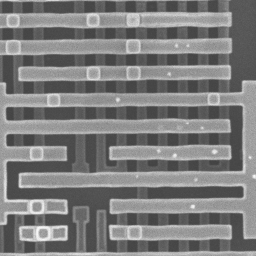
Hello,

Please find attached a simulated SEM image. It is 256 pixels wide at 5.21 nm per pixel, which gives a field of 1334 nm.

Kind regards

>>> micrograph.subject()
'wiring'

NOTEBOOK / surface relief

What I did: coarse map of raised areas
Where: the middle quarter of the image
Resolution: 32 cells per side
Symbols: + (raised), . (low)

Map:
................................
++++++++++++++++++++++++++++++++
++++++++++++++++++++++++++++++++
++++++++++++++++++++++++++++++++
................................
................................
................................
++++++++++++++++++++++++++++++++
++++++++++++++++++++++++++++++++
++++++++++++++++++++++++++++++++
+++++++++++++++....+...........+
................................
................................
................................
++++++++++++++++++++++++++++++++
++++++++++++++++++++++++++++++++
++++++++++++++++++++++++++++++++
................................
................................
................................
...............................+
+..........+++++++++++++++++++++
+..........+++++++++++++++++++++
+..........+++++++++++++++++++++
................................
................................
................................
++++++++++++++++++++++++++++++++
++++++++++++++++++++++++++++++++
++++++++++++++++++++++++++++++++
++++++++++++++++++++++++++++++++
................................